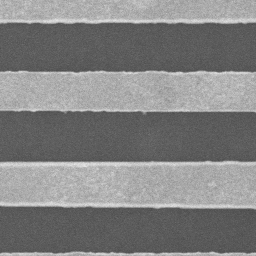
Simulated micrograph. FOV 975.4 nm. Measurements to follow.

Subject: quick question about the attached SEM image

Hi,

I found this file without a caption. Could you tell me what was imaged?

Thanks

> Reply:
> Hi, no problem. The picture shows lines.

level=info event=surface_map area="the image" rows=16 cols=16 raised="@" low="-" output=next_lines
@@@@@@@@@@@@@@@@
----------------
----------------
----------------
@@---@@--@--@-@-
@@@@@@@@@@@@@@@@
@@@@@@@@@@@@@@@@
----------------
----------------
----------------
@@@@@@@@@@@@@@@@
@@@@@@@@@@@@@@@@
@@@@@@@@@@@@@@@@
----------------
----------------
----------------